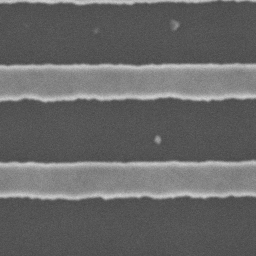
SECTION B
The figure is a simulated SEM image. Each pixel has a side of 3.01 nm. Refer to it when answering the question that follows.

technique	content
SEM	lines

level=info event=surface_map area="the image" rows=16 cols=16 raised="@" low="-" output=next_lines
----------------
----------------
----------------
----------------
@@@@@@@@@@@@@@@@
@@@@@@@@@@@@@@@@
----------------
----------------
----------------
----------------
@@@@@@@@@@@@@@@@
@@@@@@@@@@@@@@@@
----------------
----------------
----------------
----------------